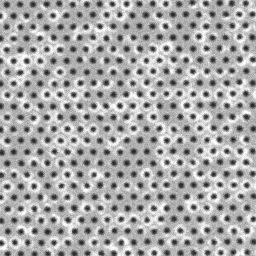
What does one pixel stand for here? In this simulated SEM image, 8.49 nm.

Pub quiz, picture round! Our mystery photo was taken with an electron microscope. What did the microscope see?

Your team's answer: a regular array of holes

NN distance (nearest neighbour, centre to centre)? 106 nanometres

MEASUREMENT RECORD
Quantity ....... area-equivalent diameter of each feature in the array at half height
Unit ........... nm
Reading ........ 60.6